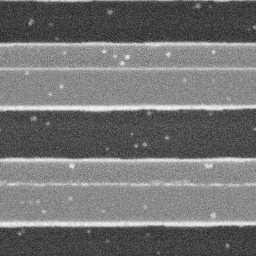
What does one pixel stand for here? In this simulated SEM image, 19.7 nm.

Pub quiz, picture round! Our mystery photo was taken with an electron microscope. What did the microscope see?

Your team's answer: lines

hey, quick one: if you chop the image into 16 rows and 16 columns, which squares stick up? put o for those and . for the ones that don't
................
................
................
oooooooooooooooo
oooooooooooooooo
oooooooooooooooo
oooooooooooooooo
................
................
................
oooooooooooooooo
oooooooooooooooo
oooooooooooooooo
oooooooooooooooo
................
................